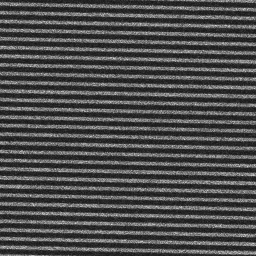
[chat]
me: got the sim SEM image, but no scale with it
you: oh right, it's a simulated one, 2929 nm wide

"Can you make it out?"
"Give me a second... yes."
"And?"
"parallel lines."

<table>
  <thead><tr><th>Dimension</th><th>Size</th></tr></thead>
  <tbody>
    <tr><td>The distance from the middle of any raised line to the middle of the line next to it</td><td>99.4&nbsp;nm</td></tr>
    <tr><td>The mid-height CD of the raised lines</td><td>42.9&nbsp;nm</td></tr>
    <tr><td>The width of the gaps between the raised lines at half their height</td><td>54.3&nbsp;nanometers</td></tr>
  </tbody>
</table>